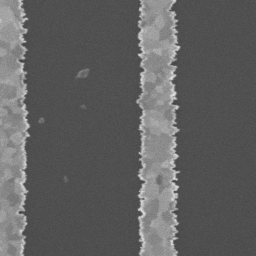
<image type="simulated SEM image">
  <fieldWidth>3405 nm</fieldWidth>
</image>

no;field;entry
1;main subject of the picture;one or a few lines or trenches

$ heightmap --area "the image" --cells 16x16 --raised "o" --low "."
o........oo.....
o........oo.....
o........oo.....
o........oo.....
o........oo.....
o........oo.....
oo.......oo.....
oo.......oo.....
oo.......oo.....
oo.......oo.....
oo.......oo.....
o........oo.....
o........oo.....
o........oo.....
o........oo.....
o........oo.....